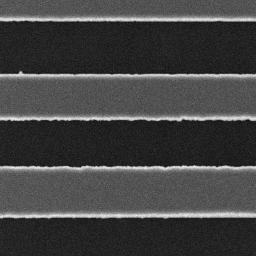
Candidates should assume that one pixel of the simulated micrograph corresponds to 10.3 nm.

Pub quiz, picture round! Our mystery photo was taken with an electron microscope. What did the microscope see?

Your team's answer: lines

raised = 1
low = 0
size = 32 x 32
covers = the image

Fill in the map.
11111111111111111111111111111111
11111111111111111111111111111111
11111111111111111111111111111111
00000000000000000000000000000000
00000000000000000000000000000000
00000000000000000000000000000000
00000000000000000000000000000000
00000000000000000000000000000000
00000000000000000000000000000000
11111111111111111111111111111111
11111111111111111111111111111111
11111111111111111111111111111111
11111111111111111111111111111111
11111111111111111111111111111111
11111111111111111111111111111111
00000000000000000000000000000000
00000000000000000000000000000000
00000000000000000000000000000000
00000000000000000000000000000000
00000000000000000000000000000000
00000000000000000000000000000000
11111111111111111111111111111111
11111111111111111111111111111111
11111111111111111111111111111111
11111111111111111111111111111111
11111111111111111111111111111111
11111111111111111111111111111111
00000000000000000000000000000000
00000000000000000000000000000000
00000000000000000000000000000000
00000000000000000000000000000000
00000000000000000000000000000000